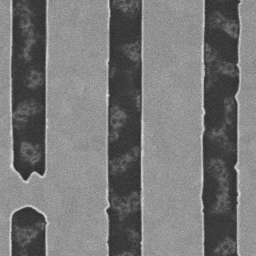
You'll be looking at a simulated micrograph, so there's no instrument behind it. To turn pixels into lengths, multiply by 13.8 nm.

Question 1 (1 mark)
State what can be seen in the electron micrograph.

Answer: one or a few lines or trenches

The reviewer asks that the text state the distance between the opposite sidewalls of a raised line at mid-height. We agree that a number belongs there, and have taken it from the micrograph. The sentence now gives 850 nm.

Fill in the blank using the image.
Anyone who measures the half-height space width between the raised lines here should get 470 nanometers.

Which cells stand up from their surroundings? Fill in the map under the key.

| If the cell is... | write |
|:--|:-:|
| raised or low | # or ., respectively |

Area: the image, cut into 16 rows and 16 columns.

#..####..####..#
#..####..####..#
#..####..####..#
#..####..####..#
#..####..####..#
#..####..####..#
#..####..####..#
#..####..####..#
#..####..####..#
#..####..####..#
#..####..####..#
#######..####..#
#######..####..#
#..####..####..#
#..####..####..#
#..####..####..#